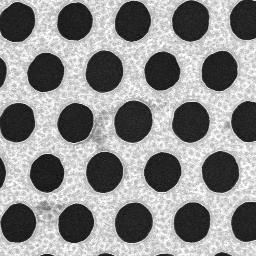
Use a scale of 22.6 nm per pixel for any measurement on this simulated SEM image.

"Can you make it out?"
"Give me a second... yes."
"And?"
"a regular array of holes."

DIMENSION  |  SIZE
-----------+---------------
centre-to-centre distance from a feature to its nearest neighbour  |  1300 nanometres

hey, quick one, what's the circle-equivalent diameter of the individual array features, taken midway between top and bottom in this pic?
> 866 nm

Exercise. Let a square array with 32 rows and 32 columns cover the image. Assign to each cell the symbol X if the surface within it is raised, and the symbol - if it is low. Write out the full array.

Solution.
X--XXXXXX-XXXXXX--XXXXX--XXXXX--
----XXXX---XXXX----XXX----XXX---
----XXX-----XX-----XXX----XXX---
----XXX----XXX-----XXX----XXX---
----XXXX---XXXX---XXXX---XXXXX--
XXXXXXXXXXXXXXXXXXXXXXXXXXXXXXXX
XXXXXXXXXXXX--XXXXXX-XXXXXX--XXX
XXXX----XXX----XXXX---XXXX---XXX
-XXX----XXX----XXX----XXX-----XX
-XX-----XXX----XXX----XXX-----XX
XXXX----XXX----XXXX---XXXX---XXX
XXXXX-XXXXXXXXXXXXXXXXXXXXXXXXXX
XXXXXXXXXXXXXXXXXXXXXXXXXXXXXXXX
X---XXXX---XXXX----XXX---XXXXX--
----XXX-----XX-----XXX----XXX---
----XXX-----XX-----XX-----XXX---
----XXX----XXX-----XXX----XXX---
X--XXXXX--XXXXX---XXXXX--XXXXX--
XXXXXXXXXXXXXXXXXXXXXXXXXXXXXXXX
XXXXX--XXXXX--XXXXX---XXXX---XXX
-XXX----XXX----XXX-----XX-----XX
-XXX----XXX----XXX-----XX-----XX
-XXX----XXX----XXX----XXX-----XX
XXXXX--XXXXX--XXXXX---XXXX---XXX
XXXXXXXXXXXXXXXXXXXXXXXXXXXXXXXX
XX-XXXXXX-XXXXXX--XXXXX--XXXXX--
X---XXXX---XXXX----XXX----XXX---
-----XX-----XX-----XXX----XXX---
----XXX-----XX-----XXX----XXX---
----XXXX---XXXX---XXXX----XXX---
XXXXXXXXXXXXXXXXXXXXXXXXXXXXXXXX
XXXXXXXXXXXXXXXXXXXXXXXXXXXXXXXX